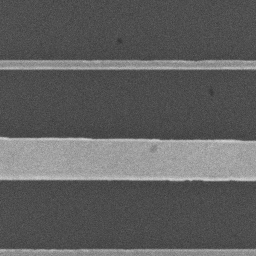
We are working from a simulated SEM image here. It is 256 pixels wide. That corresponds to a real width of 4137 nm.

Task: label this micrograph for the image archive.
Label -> lines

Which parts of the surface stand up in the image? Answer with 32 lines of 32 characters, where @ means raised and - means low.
--------------------------------
--------------------------------
--------------------------------
--------------------------------
--------------------------------
--------------------------------
--------------------------------
--------------------------------
--------------------------------
--------------------------------
--------------------------------
--------------------------------
--------------------------------
--------------------------------
--------------------------------
--------------------------------
--------------------------------
@@@@@@@@@@@@@@@@@@@-------------
@@@@@@@@@@@@@@@@@@@@@@@@@@@@@@@@
@@@@@@@@@@@@@@@@@@@@@@@@@@@@@@@@
@@@@@@@@@@@@@@@@@@@@@@@@@@@@@@@@
@@@@@@@@@@@@@@@@@@@@@@@@@@@@@@@@
--------------------------------
--------------------------------
--------------------------------
--------------------------------
--------------------------------
--------------------------------
--------------------------------
--------------------------------
--------------------------------
@@@@@@@@@@@@@@@@@@@@@@@@@@@@@@@@